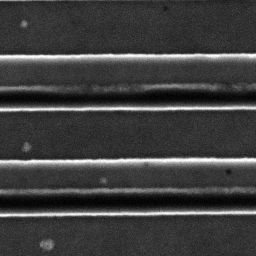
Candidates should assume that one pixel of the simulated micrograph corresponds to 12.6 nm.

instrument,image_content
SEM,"lines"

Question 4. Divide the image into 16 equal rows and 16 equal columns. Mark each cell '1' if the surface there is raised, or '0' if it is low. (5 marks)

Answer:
0000000000000000
0000000000000000
0000000000000000
0000010000111111
1111111111111111
1111111111111111
1111111111111111
0000000000000000
0000000000000000
0000000000000000
1111111111111111
1111111111111111
1111111111111111
0000000000000000
0000000000000000
0000000000000000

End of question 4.